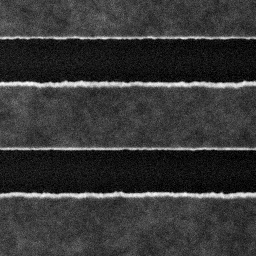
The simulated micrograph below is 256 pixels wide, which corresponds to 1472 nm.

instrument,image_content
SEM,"lines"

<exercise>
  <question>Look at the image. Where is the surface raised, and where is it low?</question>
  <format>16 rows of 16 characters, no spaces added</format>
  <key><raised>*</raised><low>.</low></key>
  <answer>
****************
****************
................
................
................
****************
****************
****************
****************
................
................
................
****************
****************
****************
****************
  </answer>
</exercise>